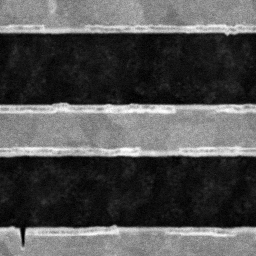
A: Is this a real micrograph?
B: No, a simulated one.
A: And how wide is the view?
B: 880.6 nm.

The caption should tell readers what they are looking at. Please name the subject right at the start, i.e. one or a few lines or trenches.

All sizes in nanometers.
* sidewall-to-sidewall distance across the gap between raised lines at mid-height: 256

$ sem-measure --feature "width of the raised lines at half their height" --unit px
48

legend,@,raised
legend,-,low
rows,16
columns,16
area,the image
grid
@@@@@@@@@@@@@@@@
@@@@@@@@@@@@@@@@
----------------
----------------
----------------
----------------
----------------
@@@@@@@@@@@@@@@@
@@@@@@@@@@@@@@@@
@@@@@@@@@@@@@@@@
----------------
----------------
----------------
----------------
@-@@@@@@@@@@@@@@
@@@@@@@@@@@@@@@@